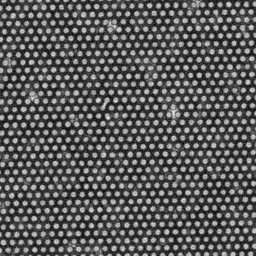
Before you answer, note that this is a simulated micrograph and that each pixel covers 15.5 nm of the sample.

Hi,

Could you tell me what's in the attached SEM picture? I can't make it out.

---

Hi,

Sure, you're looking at a regular array of raised bodies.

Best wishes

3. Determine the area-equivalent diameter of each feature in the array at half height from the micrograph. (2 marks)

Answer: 0.0679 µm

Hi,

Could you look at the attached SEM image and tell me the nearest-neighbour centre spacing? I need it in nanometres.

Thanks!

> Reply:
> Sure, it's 134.